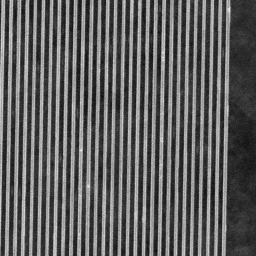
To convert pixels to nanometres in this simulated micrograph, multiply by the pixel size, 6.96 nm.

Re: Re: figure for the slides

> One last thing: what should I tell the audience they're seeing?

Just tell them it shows parallel lines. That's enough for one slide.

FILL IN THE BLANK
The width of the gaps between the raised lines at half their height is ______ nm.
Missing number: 37.4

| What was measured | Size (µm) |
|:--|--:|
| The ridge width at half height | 0.0191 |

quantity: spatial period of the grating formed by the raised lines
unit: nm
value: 56